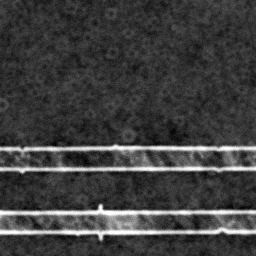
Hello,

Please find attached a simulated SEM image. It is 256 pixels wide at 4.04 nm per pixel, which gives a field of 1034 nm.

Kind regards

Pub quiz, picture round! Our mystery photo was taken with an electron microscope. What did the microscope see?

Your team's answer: one or a few lines or trenches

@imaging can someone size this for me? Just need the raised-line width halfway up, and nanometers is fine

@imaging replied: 82.9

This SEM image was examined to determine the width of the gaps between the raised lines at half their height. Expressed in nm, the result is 172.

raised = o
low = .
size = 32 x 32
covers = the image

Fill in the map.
................................
................................
................................
................................
................................
................................
................................
................................
................................
................................
................................
................................
................................
................................
................................
................................
................................
................................
..............ooooooo...........
oooooooooooooooooooooooooooooooo
oooooooooooooooooooooooooooooooo
................................
................................
................................
................................
................................
............o...................
oooooooooooooooooooooooooooooooo
oooooooooooooooooooooooooooooooo
................................
................................
................................